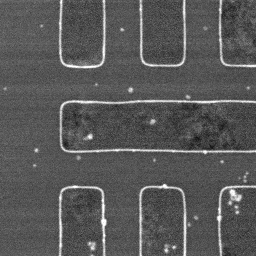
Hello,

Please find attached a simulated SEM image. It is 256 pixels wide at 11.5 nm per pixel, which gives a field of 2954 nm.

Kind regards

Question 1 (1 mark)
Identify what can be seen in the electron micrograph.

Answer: groups of lines, slits or small figures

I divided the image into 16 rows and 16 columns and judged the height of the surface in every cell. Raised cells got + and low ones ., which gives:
....++...+++..++
....+++..+++..++
....++...+++..++
....++...+++..++
................
................
....++++++++++++
....++++++++++++
....++++++++++++
............+...
................
................
....++...+++..++
....++...+++..++
....++...+++..++
....++...+++..++